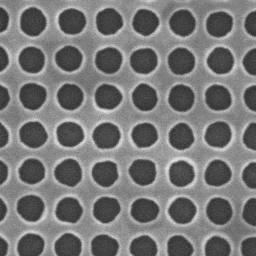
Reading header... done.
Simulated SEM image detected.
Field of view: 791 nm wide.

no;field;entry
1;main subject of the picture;a regular array of holes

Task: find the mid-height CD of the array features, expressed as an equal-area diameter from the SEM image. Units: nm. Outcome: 85.5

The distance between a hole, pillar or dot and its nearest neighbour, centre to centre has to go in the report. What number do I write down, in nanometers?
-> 113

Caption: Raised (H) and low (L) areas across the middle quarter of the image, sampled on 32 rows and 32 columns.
LLLLHHHHLLLLLLHHHLLLLLLHHHLLLLLL
LLLLHHHHHLLLLLHHHLLLLLHHHHHLLLLL
HHHHHHHHHHHLHHHHHHLLLHHHHHHHLLHH
HHHHHHHHHHHHHHHHHHHHHHHHHHHHHHHH
HHHHHHHHHHHHHHHHHHHHHHHHHHHHHHHH
LLLHHHHHHLLLLHHHHHLLLHHHHHHHLLLH
LLLLHHHHLLLLLLHHHLLLLLLHHHHLLLLL
LLLLLHHHLLLLLLLHHLLLLLLLHHLLLLLL
LLLLLHHLLLLLLLLHHLLLLLLLHHLLLLLL
LLLLLHHHLLLLLLHHHLLLLLLHHHLLLLLL
LLLLHHHHLLLLLHHHHHLLLLLHHHHLLLLL
LLLHHHHHHHLLHHHHHHHLLLHHHHHHLLLH
HHHHHHHHHHHHHHHHHHHHHHHHHHHHHHHH
HHHHHHHHHHHHHHHHHHHHHHHHHHHHHHHH
LLLHHHHHHHLHHHHHHHHHLHHHHHHHHHHH
LLLLHHHHLLLLLHHHHHLLLLLHHHHHLLLH
LLLLLHHHLLLLLLHHHLLLLLLHHHLLLLLL
LLLLLHHLLLLLLLHHHLLLLLLLHHLLLLLL
LLLLLHHLLLLLLLLHHLLLLLLLHHLLLLLL
LLLLHHHHLLLLLLHHHLLLLLLHHHLLLLLL
LLLHHHHHLLLLLHHHHHLLLLHHHHHLLLLL
HHHHHHHHHHHHHHHHHHHHHHHHHHHHHLHH
HHHHHHHHHHHHHHHHHHHHHHHHHHHHHHHH
HLHHHHHHHHHHHHHHHHHHHHHHHHHHHHHH
LLLLHHHHHLLLLHHHHLLLLLHHHHHLLLLH
LLLLHHHLLLLLLHHHHLLLLLLHHHLLLLLL
LLLLLHHLLLLLLHHHLLLLLLLHHHLLLLLL
LLLLLHHLLLLLLHHHLLLLLLLHHHLLLLLL
LLLLLHHLLLLLLHHHHLLLLLLHHHLLLLLL
LLLLHHHHLLLLLHHHHHLLLLHHHHHLLLLL
HLLHHHHHHLLLHHHHHHHHHHHHHHHLLLLH
HHHHHHHHHHHHHHHHHHHHHHHHHHHHHHHH